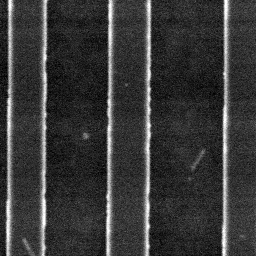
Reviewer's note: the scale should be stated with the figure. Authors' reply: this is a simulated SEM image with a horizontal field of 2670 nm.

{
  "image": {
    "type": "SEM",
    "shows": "lines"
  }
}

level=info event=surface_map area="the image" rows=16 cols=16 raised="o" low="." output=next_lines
.oo....oo.....oo
.oo....oo.....oo
.oo....oo.....oo
.oo....oo.....oo
.oo....oo.....oo
.oo....oo.....oo
.oo....oo.....oo
.oo....oo.....oo
.oo....oo.....oo
.oo....oo.....oo
.oo....oo.....oo
.oo....oo.....oo
ooo....oo.....oo
ooo....oo.....oo
ooo....oo.....oo
ooo....oo.....oo